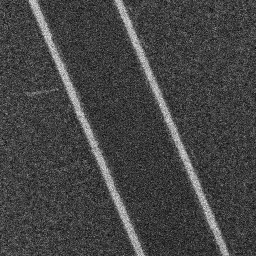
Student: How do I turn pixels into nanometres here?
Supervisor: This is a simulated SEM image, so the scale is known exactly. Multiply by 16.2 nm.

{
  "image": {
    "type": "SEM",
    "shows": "one or a few lines or trenches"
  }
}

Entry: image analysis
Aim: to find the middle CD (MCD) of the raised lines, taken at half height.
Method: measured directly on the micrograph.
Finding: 1270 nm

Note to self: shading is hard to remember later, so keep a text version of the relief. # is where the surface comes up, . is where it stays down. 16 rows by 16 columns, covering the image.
..######........
...#####........
...#####........
....#####.......
....#####.......
....######......
.....#####......
.....######.....
......#####.....
......#####.....
......######....
.......#####....
.......######...
........#####...
........#####...
.........#####..